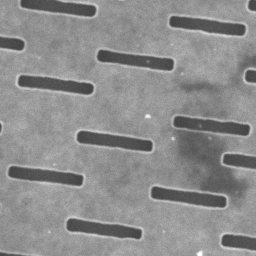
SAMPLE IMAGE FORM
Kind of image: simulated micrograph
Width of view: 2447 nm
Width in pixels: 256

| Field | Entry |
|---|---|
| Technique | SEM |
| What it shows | a regular array of holes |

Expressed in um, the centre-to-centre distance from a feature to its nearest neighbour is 0.741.